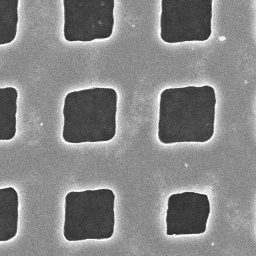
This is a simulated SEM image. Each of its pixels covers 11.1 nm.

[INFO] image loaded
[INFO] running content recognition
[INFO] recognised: holes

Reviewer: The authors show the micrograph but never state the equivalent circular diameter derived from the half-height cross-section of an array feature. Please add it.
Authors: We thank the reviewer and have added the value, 0.64 µm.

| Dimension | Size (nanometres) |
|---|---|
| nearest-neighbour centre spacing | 1080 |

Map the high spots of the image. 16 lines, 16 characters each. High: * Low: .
.***...***...***
.***...***...***
.***..****...***
****************
****************
.*****.****..***
.***...***...***
.***...***...***
.***...***...***
****************
****************
****************
.***...****..***
.***...***...***
.***...****..***
****************